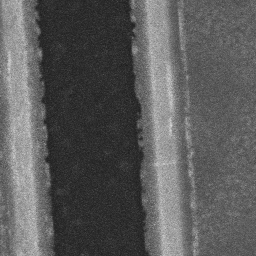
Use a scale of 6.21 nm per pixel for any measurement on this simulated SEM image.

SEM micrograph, one or a few lines or trenches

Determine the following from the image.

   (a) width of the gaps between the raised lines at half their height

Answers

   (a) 880 nm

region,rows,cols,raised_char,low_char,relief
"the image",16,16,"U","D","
UDDDDDDDDDUUUUUU
UDDDDDDDDDUUUUUU
UDDDDDDDDDUUUUUU
UDDDDDDDDDUUUUUU
UDDDDDDDDDUUUUUU
UDDDDDDDDDUUUUUU
UDDDDDDDDDUUUUUU
UDDDDDDDDDUUUUUU
UDDDDDDDDDUUUUUU
UDDDDDDDDDUUUUUU
UDDDDDDDDDUUUUUU
UUDDDDDDDDUUUUUU
UUDDDDDDDDDUUUUU
UUDDDDDDDDDUUUUU
UUDDDDDDDDDUUUUU
UUDDDDDDDDDUUUUU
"